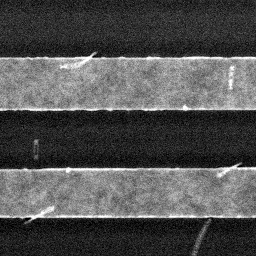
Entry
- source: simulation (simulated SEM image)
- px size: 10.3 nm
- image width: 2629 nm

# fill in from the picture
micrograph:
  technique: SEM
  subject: lines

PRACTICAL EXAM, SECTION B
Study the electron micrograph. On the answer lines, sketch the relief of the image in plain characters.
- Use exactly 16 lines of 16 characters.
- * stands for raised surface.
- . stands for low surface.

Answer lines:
................
................
................
................
****************
****************
****************
................
................
................
..............*.
****************
****************
****************
................
................